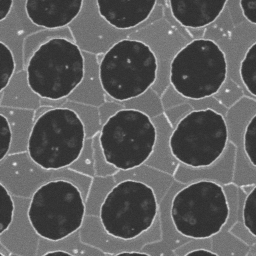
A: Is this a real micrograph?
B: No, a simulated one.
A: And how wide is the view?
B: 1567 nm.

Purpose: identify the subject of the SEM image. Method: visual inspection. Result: a regular array of holes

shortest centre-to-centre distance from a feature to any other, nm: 428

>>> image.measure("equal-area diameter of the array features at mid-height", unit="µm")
0.347